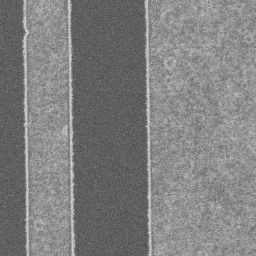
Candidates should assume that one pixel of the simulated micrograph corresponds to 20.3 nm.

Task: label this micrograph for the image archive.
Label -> one or a few lines or trenches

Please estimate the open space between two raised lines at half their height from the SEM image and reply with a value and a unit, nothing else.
886 nm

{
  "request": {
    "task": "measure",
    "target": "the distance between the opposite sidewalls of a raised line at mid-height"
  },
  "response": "1.6 um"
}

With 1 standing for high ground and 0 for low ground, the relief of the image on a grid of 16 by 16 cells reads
1100111110000000
1100111110000000
1100111110000000
1100111110000000
1100111110000000
1100111110000000
1100111110000000
1100111110000000
1100111110000000
1100111110000000
1100111110000000
1100111110000000
1100111110000000
1100011110000000
1100011110000000
1100011110000000